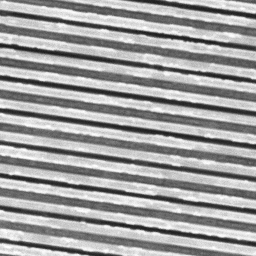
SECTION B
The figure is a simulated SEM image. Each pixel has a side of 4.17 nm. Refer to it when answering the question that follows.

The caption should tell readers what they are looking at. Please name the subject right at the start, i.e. parallel lines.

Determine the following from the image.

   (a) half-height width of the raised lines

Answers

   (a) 37.6 nm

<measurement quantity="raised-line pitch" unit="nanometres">67.2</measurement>